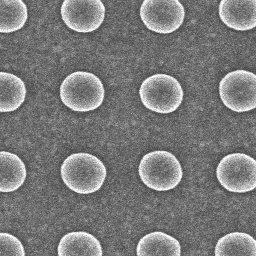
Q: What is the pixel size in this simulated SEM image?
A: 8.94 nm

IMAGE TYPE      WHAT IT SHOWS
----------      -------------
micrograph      raised bodies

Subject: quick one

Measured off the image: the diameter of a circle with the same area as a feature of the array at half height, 369 nanometres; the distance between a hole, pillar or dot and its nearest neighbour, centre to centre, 688 nm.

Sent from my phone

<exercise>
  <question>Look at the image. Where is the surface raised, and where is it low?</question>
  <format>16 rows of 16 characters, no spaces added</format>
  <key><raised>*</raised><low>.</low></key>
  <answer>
**..**...**...**
*...**...**...**
................
................
................
*...**...**...**
*...**...**...**
................
................
................
**..**...**...**
*...**...**...**
................
................
................
*...**...**...**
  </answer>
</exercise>